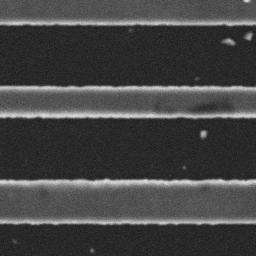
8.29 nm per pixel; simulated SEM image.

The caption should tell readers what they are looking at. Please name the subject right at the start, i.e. lines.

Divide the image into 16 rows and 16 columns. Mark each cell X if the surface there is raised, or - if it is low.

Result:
XXXXXXXXXXXXXXXX
XXXXXXXXXXXXXXXX
----------------
----------------
----------------
XXXXXXXXXXXXXXXX
XXXXXXXXXXXXXXXX
----------------
----------------
----------------
----------------
XXXXXXXXXXXXXXXX
XXXXXXXXXXXXXXXX
XXXXXXXXXXXXXXXX
----------------
----------------